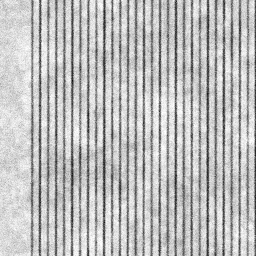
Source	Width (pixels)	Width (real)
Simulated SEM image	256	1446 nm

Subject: parallel lines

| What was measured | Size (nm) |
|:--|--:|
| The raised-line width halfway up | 31.8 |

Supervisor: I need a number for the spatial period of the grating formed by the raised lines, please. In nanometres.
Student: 45.1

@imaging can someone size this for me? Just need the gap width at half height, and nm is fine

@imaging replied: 15.5